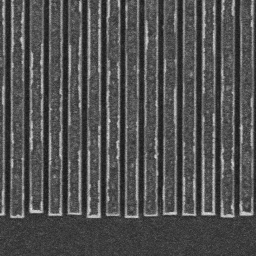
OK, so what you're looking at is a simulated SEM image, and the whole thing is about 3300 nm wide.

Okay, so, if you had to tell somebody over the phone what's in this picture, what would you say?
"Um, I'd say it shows parallel lines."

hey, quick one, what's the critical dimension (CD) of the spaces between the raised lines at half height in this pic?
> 83.8 nanometres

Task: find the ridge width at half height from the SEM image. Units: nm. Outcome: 166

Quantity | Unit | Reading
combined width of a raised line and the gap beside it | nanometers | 247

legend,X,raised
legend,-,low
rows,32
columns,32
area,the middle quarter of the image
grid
-XXX--XXX--XXX--XX--XXX--XXX--XX
-XXX--XXX--XXX--XXX-XXX--XXX--XX
-XXX--XXX--XXX--XX--XXX--XXX--XX
-XXX--XXX--XXX--XX--XXX--XXX--XX
-XXX--XXX--XXX--XX--XXX--XXX--XX
-XXX--XXX--XXX--XX--XXX--XXX--XX
-XXX--XXX--XXX--XX--XXX--XXX--XX
-XXX--XXX--XXX-XXX--XXX--XXX--XX
-XXX--XXX--XXX--XX--XXX--XXX--XX
-XXX--XXX--XXX--XX--XXX--XXX--XX
-XXX--XXX--XXX-XXX--XXX--XXX--XX
-XXX--XXX--XXX-XXX--XXX--XXX--XX
-XXX--XXX--XXX--XX--XXX--XXX--XX
-XXX--XXX--XXX--XX--XXX--XXX--XX
-XXX--XXX--XXX--XX--XXX--XXX--XX
-XXX--XXX--XXX--XX--XXX--XXX--XX
-XXX--XXX--XXX--XX--XXX--XXX--XX
-XXX--XXX--XXX--XX--XXX--XXX--XX
-XXX--XXX--XXX--XX--XXX--XXX--XX
-XXX--XXX--XXX--XX--XXX--XXX--XX
-XXX--XXX--XXX--XX--XXX--XXX--XX
-XXX--XXX--XXX--XX--XXX--XXX--XX
-XXX--XXX--XXX-XXX--XXX--XXX--XX
-XXX--XXX--XXX-XXX--XXX--XXX--XX
-XXX--XXX--XXX--XX--XXX--XXX--XX
-XXX--XXX--XXX--XX--XXX--XXX--XX
-XXX--XXX--XXX-XXX--XXX--XXX--XX
-XXX--XXX--XXX-XXX--XXX--XXX--XX
-XXX--XXX--XXX--XX--XXX--XXX--XX
-XXX--XXX--XXX-XXX--XXX--XXX--XX
-XXX--XXX--XXX--XX--XXX--XXX--XX
-XXX--XXX--XXX--XX--XXX--XXX--XX